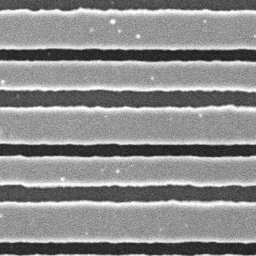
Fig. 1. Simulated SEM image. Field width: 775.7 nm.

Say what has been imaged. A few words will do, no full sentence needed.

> lines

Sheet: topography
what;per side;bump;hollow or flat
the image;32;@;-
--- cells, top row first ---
--------------------------------
@@@@@@@@@@@@@@@@@@@@@@@@@@@@@@@@
@@@@@@@@@@@@@@@@@@@@@@@@@@@@@@@@
@@@@@@@@@@@@@@@@@@@@@@@@@@@@@@@@
@@@@@@@@@@@@@@@@@@@@@@@@@@@@@@@@
@@@@@@@@@@@@@@@@@@@@@@@@@@@@@@@@
--------------------------------
--------------------------------
@@@@@@@@@@@@@@@@@@@@@@@@@@@@@@@@
@@@@@@@@@@@@@@@@@@@@@@@@@@@@@@@@
@@@@@@@@@@@@@@@@@@@@@@@@@@@@@@@@
--------------------------------
--------------------------------
@@--@@@@@@@@@--@@@@-@@-@-@@@@@@@
@@@@@@@@@@@@@@@@@@@@@@@@@@@@@@@@
@@@@@@@@@@@@@@@@@@@@@@@@@@@@@@@@
@@@@@@@@@@@@@@@@@@@@@@@@@@@@@@@@
@@@@@@@@@@@@@@@@@@@@@@@@@@@@@@@@
--------------------------------
--@-----------------------------
@@@@@@@@@@@@@@@@@@@@@@@@@@@@@@@@
@@@@@@@@@@@@@@@@@@@@@@@@@@@@@@@@
@@@@@@@@@@@@@@@@@@@@@@@@@@@@@@@@
--------------------------------
--------------------------------
@@@@@@@@@@@@@@@@@@@@@@@@@@@@@@@@
@@@@@@@@@@@@@@@@@@@@@@@@@@@@@@@@
@@@@@@@@@@@@@@@@@@@@@@@@@@@@@@@@
@@@@@@@@@@@@@@@@@@@@@@@@@@@@@@@@
@@@@@@@@@@@@@@@@@@@@@@@@@@@@@@@@
--------------------------------
--------------------------------